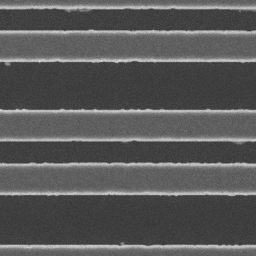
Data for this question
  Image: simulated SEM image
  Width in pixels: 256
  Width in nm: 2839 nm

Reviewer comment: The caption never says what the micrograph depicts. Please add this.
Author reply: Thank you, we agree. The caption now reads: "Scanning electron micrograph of lines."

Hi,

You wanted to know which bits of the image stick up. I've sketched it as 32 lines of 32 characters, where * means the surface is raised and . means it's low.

********************************
................................
................................
................................
********************************
********************************
********************************
********************************
................................
................................
................................
................................
................................
................................
********************************
********************************
********************************
*********.******..**********.***
................................
................................
.........*....*.*...............
********************************
********************************
********************************
................................
................................
................................
................................
................................
................................
................................
********************************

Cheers